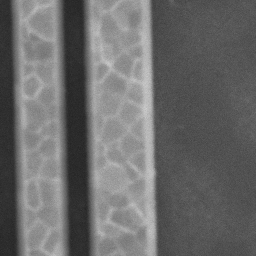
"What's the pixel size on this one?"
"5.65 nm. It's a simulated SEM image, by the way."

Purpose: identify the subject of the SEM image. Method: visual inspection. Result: one or a few lines or trenches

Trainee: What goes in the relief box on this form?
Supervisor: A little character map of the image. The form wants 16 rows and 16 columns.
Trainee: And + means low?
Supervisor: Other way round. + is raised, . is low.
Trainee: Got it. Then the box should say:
.+++.++++.......
.+++..+++.......
.+++..+++.......
.+++..+++.......
.+++..+++.......
.+++..+++.......
.+++..+++.......
.+++..+++.......
.+++..+++.......
.+++..+++.......
.+++..+++.......
.+++..+++.......
.+++..+++.......
.+++..+++.......
.+++..+++.......
.+++..++++......